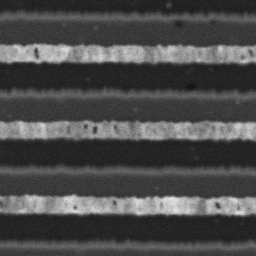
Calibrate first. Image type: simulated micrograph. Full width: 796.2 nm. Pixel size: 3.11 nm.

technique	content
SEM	lines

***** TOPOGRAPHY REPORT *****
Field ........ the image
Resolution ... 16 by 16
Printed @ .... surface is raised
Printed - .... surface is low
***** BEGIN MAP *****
----------------
@@@@@@@@@@@@@@@@
@@@@@@@@@@@@@@@@
@@@@@@@@@@@@@@@@
----------------
----------------
@@@@@@@@@@@@@@@@
@@@@@@@@@@@@@@@@
@@@@@@@@@@@@@@@@
----------------
----------------
@@@@@@@@@@@@@@@@
@@@@@@@@@@@@@@@@
----------------
----------------
@@@@@@@@@@@@@@@@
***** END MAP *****